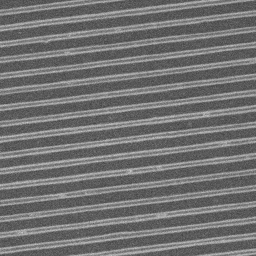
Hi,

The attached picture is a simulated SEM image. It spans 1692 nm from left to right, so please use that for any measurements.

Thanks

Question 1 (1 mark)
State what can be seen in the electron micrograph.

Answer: parallel lines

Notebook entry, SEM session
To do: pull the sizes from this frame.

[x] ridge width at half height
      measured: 33.6 nm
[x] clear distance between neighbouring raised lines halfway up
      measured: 73 nm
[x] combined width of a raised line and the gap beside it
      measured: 104 nanometres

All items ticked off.